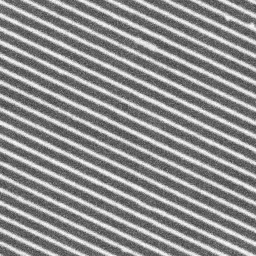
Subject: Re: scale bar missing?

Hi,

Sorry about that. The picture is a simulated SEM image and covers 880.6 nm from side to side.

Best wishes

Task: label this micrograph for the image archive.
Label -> parallel lines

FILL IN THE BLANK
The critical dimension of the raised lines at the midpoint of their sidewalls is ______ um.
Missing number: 0.0101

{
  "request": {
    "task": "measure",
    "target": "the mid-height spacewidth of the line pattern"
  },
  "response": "30.3 nanometres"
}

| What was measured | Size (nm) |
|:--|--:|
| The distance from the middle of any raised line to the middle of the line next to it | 41.7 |